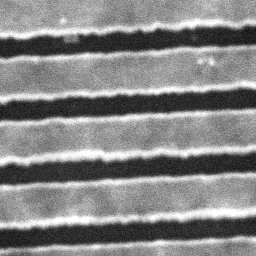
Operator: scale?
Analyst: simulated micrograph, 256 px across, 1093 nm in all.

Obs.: lines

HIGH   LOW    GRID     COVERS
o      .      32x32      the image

oooooooooooooooooooooooooooooooo
oooooooooooooooooooooooooooooooo
oooooooooooooooooooooooooooooooo
ooooooooooooooooooooooo.........
o.oo............................
................................
..................oooooooooooooo
oooooooooooooooooooooooooooooooo
oooooooooooooooooooooooooooooooo
oooooooooooooooooooooooooooooooo
oooooooooooooooooooooooooooooooo
ooooooooooooooooooooo.o.........
o...............................
................................
................oooooooooooooooo
oooooooooooooooooooooooooooooooo
oooooooooooooooooooooooooooooooo
oooooooooooooooooooooooooooooooo
oooooooooooooooooooooooooooooooo
ooooooooooooooooooo.............
................................
................................
.............o.ooooooooooooooooo
oooooooooooooooooooooooooooooooo
oooooooooooooooooooooooooooooooo
oooooooooooooooooooooooooooooooo
oooooooooooooooooooooooooooooooo
oooooooooooooooooooo............
................................
................................
..............oooooooooooooooooo
oooooooooooooooooooooooooooooooo